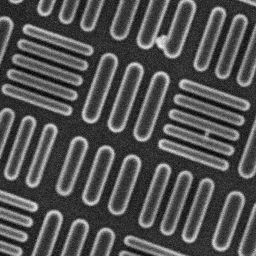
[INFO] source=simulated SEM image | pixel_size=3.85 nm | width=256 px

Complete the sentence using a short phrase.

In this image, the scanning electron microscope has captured groups of lines, slits or small figures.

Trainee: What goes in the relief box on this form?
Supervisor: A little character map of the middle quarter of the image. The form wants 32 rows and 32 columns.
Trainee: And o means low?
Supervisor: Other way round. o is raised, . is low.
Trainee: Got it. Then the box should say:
..oooo...oooo...ooo.............
........ooooo...oooo............
oo......oooo...ooooo...oo.......
oooo....oooo...oooo...oooo......
.ooo...ooooo...oooo...oooo...ooo
.......oooo...oooo...ooooo...ooo
oo.....oooo...oooo...ooooo.....o
ooo...ooooo...oooo...oooo.......
.oo...oooo...ooooo...oooo...ooo.
......oooo...oooo...oooo....oooo
o....ooooo...oooo...oooo......oo
oo...oooo...oooo...ooooo........
o....oooo...oooo...oooo...ooooo.
.....ooo....oooo...oooo....ooooo
...........oooo...ooooo.......oo
...........oooo...oooo...oo.....
............oo....oooo...ooooo..
..................oooo....oooooo
..................ooo........ooo
..ooo...................oo......
..oooo..................oooooo..
.oooo....ooo..............oooooo
.oooo...oooo.................ooo
.oooo...oooo....oo.............o
.ooo....oooo...oooo.............
oooo...ooooo...oooo.....oo......
oooo...oooo...ooooo....ooo......
ooo....oooo...oooo.....ooo...ooo
ooo...oooo...ooooo....oooo...ooo
oo....oooo...ooooo....oooo..oooo
oo....oooo...oooo.....ooo...oooo
oo...ooooo...oooo....oooo..oooo.